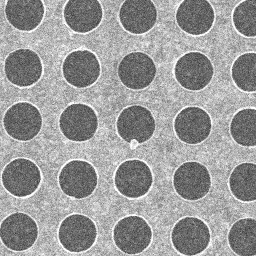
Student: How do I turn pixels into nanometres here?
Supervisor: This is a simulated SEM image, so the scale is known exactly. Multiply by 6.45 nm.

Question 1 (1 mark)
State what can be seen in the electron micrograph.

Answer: a regular array of holes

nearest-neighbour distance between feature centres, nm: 348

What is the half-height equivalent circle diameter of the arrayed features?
251 nm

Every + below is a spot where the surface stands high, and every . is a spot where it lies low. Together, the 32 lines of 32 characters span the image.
+....+++.....++....++++...++++..
+.....++.....++.....++.....++...
+....+++.....++.....++.....++...
++..+++++...++++...++++...+++...
++++++++++++++++++++++++++++++..
++++++++++++++++++.+++++++++++++
+...++.++..+++++++++++++.+++++++
+....+++....+++....+++....+++...
+....+++.....++.....++.....++...
+....+++....+++....+++.....++...
++..+++++...+++....+++....+++...
+++++++++++++++++++++++++++++++.
++++++++++++++++++++++++++++++++
+....+++...+++++..+++++..+++++++
.....+++....+++....+++....+++...
.....++.....+++....+++....+++...
+....+++....+++....+++....+++...
++..+++++..++++....++++...+++...
++++++++++++++++++++++++++++++++
++++++++++++++++++++++++++++++++
+...++++...++++...+++++..+++++..
.....+++....++.....+++....+++...
.....++.....++.....+++....+++...
+....+++....+++....+++....+++...
++.++++++..+++++..++++....+++...
++++++++++++++++++++++++++++++++
++++++++++++++++++++++++++++++++
....++++...++++...++++...+++++..
.....++.....++.....+++....+++...
.....++.....++.....++.....+++...
....++++....++.....+++....+++...
+++++++++.+++++...++++...++++...